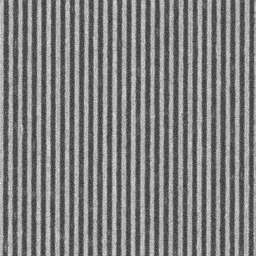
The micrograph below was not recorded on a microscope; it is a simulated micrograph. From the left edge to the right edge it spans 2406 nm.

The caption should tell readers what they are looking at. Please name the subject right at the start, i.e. parallel lines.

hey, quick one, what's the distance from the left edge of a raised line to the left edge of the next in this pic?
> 0.0888 microns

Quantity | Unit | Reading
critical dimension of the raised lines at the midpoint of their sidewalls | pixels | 3.37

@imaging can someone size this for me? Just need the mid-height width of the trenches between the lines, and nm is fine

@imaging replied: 63.4